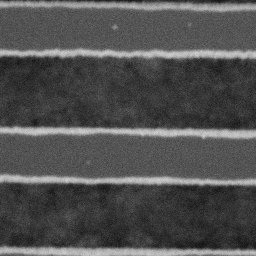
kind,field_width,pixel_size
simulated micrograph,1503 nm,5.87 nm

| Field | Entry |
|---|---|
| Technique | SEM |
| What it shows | lines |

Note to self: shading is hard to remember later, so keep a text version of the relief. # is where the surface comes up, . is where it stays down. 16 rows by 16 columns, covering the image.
################
################
################
................
................
................
................
................
################
################
################
................
................
................
................
................